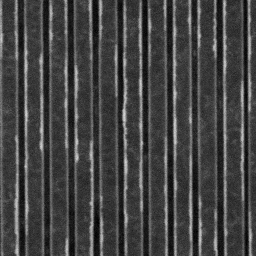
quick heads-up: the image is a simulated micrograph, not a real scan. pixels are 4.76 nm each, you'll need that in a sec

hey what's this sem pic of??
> parallel lines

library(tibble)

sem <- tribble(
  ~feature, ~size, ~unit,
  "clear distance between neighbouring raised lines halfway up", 32.7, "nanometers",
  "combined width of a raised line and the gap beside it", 0.119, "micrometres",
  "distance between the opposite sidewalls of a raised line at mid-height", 84.5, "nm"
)